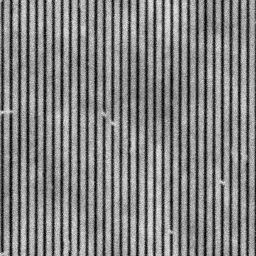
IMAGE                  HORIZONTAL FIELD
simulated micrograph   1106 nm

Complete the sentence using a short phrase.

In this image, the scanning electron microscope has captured parallel lines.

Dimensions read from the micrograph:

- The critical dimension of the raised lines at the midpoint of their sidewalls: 23.2 nm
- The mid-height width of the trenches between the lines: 11.9 nanometers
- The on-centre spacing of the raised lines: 36.5 nanometres